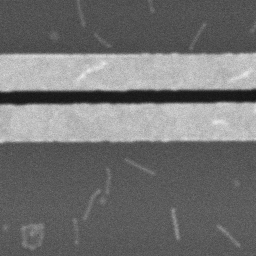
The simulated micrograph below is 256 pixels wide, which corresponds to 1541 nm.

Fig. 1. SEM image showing lines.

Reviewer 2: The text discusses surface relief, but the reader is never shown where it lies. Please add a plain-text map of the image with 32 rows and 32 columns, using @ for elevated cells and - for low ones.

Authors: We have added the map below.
--------------------------------
--------------------------------
--------------------------------
--------------------------------
--------------------------------
--------------------------------
--------------------------------
@@@@@@@@@@@@@@@@@@@@@@@@@@@@@@@@
@@@@@@@@@@@@@@@@@@@@@@@@@@@@@@@@
@@@@@@@@@@@@@@@@@@@@@@@@@@@@@@@@
@@@@@@@@@@@@@@@@@@@@@@@@@@@@@@@@
--------------------------------
--------------------------------
@@@@@@@@@@@@@@@@@@@@@@@@@@@@@@@@
@@@@@@@@@@@@@@@@@@@@@@@@@@@@@@@@
@@@@@@@@@@@@@@@@@@@@@@@@@@@@@@@@
@@@@@@@@@@@@@@@@@@@@@@@@@@@@@@@@
@@@@@@@@@@@@@@@@@---@-----------
--------------------------------
--------------------------------
--------------------------------
--------------------------------
--------------------------------
--------------------------------
--------------------------------
--------------------------------
--------------------------------
--------------------------------
--------------------------------
--------------------------------
--------------------------------
--------------------------------